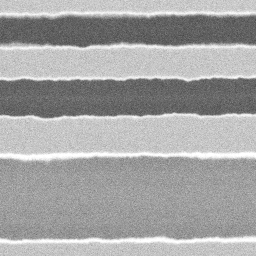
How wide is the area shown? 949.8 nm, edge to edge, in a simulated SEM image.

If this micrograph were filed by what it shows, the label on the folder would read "lines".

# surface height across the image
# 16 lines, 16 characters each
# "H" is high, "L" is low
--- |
HHHHHHHHHHHHHHHH
LLLLLLLLLLLLLLLL
LLLLLLLLLLLLLLLL
HHHHHHHHHHHHHHHH
HHHHHHHHHHHHHHHH
LLLLLLLLLLLLLLLL
LLLLLLLLLLLLLLLL
HHHHHHHHHHHHHHHH
HHHHHHHHHHHHHHHH
HHHHHHHHHHHHHHHH
LLLLLLLLLLLLLLLL
LLLLLLLLLLLLLLLL
LLLLLLLLLLLLLLLL
LLLLLLLLLLLLLLLL
LLLLLLLLLLLLLLLL
HHHHHHHHHHHHHHHH